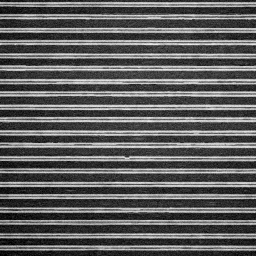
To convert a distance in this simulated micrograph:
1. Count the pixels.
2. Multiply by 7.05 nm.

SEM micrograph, parallel lines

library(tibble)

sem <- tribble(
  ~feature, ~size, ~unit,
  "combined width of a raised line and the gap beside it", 90.3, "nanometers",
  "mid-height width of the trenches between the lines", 8.88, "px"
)